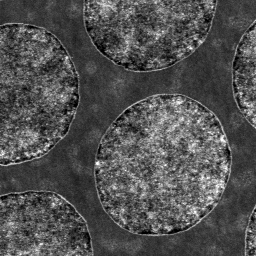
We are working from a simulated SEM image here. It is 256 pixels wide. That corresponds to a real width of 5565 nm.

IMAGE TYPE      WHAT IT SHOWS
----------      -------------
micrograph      holes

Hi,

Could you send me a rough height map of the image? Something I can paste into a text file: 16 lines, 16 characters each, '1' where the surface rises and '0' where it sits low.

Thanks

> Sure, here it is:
1111100000000111
1111100000000111
0000110000000110
0000111000001110
0000011111111110
0000011111111110
0000011100000110
0000011000000011
0000110000000011
0001110000000011
1111110000000011
1111110000000011
0000110000000011
0000011000000111
0000001100011110
0000001111111110